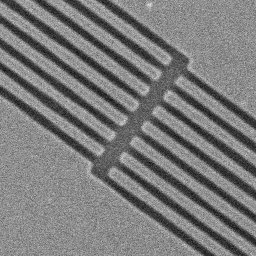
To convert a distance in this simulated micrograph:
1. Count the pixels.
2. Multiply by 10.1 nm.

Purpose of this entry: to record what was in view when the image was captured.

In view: groups of lines, slits or small figures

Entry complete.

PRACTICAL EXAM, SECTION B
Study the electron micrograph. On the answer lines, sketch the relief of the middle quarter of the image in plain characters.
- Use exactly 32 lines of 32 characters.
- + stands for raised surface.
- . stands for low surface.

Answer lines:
..++++....++++....++++.........+
...+++++...++++....+++++.......+
+...+++++....++++....+++........
++....++++....++++....+......+..
+++....++++....++++.........+++.
.++++....++++....++++........+++
..++++....++++....+++.........++
...+++++...+++++...+......++...+
+....++++....++++........++++...
++....++++....++++........++++..
++++...+++++...+++..........++++
.++++....++++...++.....++....+++
..++++....+++++........+++....++
....++++....+++.........++++...+
+....++++....++..........++++...
+++....+++..........+++...+++++.
++++....++++........++++...+++++
.++++....++++........++++....+++
..++++....++..........++++....++
....++++.........+++....++++....
+....++++........++++....++++...
++.....+++.........++++...+++++.
++++....+...........++++....++++
+++++.........+++....++++....+++
++++++.........++++....++++....+
+++++++.........++++....++++....
++++++......++...++++.....+++...
+++++++....++++...+++++....+++..
++++++++....++++....++++....++++
++++++++++...+++++...++++.....++
+++++++++++....++++....++++....+
++++++++++++....++++....++++....